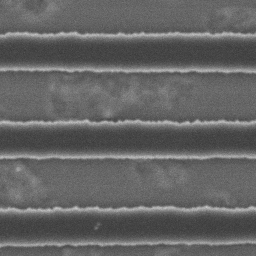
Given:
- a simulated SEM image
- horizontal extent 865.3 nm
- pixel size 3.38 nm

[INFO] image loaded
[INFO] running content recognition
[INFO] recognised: lines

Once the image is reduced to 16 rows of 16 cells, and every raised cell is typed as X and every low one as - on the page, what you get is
----------------
----------------
XXXXXXXXXXXXXXXX
XXXXXXXXXXXXXXXX
---------------X
----------------
----------------
----------------
XXXXXXXXXXXXXXXX
XXXXXXXXXXXXXXXX
----------------
----------------
----------------
XXXXXXXXXXXXXXXX
XXXXXXXXXXXXXXXX
----------------